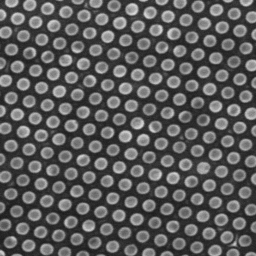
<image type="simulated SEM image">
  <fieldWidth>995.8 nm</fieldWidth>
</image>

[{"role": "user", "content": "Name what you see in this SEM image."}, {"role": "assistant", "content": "a regular array of raised bodies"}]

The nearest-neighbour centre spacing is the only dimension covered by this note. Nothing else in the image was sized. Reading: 0.0703 microns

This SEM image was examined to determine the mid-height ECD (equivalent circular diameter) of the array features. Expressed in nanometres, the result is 45.9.